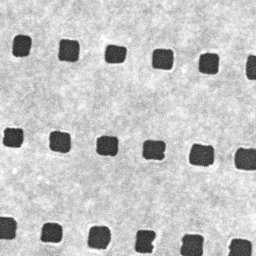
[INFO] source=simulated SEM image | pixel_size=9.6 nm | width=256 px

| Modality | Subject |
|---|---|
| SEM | a regular array of holes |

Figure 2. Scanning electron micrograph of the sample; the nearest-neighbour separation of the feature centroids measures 450 nanometres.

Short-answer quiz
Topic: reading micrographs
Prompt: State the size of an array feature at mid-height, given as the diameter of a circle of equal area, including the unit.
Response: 228 nm